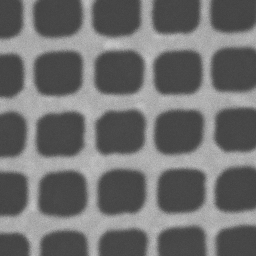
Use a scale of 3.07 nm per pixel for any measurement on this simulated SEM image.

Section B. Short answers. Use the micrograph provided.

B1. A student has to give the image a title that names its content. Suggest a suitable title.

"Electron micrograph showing a regular array of holes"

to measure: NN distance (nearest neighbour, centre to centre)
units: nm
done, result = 180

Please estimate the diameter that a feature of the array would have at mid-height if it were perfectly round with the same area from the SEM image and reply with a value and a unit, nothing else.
157 nm